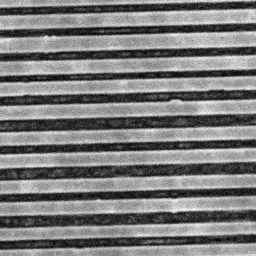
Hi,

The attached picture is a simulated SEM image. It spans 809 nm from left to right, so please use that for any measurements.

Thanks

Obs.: parallel lines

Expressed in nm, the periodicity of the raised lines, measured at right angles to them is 74.3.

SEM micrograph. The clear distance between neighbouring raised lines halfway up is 27.6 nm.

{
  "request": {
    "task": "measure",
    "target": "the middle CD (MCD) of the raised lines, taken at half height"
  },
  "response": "43 nm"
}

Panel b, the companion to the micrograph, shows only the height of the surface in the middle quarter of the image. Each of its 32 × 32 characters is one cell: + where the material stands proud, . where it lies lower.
++++++++++++++++++++++++++++++++
++++++++++++++++++++++++++++++++
................................
................................
++++++++++++++++++++++++++++++++
++++++++++++++++++++++++++++++++
++++++++++++++++++++++++++++++++
+...............................
................................
..........................++++++
++++++++++++++++++++++++++++++++
++++++++++++++++++++++++++++++++
++++++++++++++++++++++++++++++++
++++............................
................................
................................
...................+++++++++++++
++++++++++++++++++++++++++++++++
++++++++++++++++++++++++++++++++
++++++++++++++++................
................................
................................
++++++++++++++++++++++++++++++++
++++++++++++++++++++++++++++++++
++++++++++++++++++++++++++++++++
+...............................
................................
................................
................++++++++++++++++
++++++++++++++++++++++++++++++++
++++++++++++++++++++++++++++++++
+++++++++++++++++++++++.........